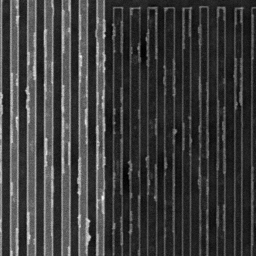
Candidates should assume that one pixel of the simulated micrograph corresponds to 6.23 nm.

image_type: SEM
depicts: parallel lines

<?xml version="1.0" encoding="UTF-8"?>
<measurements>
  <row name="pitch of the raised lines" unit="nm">107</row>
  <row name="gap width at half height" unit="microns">0.0576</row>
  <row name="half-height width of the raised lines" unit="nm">52.2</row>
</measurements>